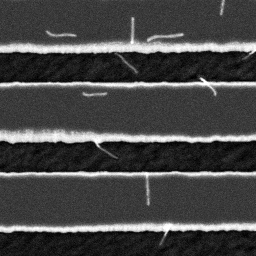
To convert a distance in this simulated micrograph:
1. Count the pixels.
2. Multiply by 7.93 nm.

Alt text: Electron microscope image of lines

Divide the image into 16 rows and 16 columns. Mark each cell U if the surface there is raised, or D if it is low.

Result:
UUUUUUUUUUUUUUUU
UUUUUUUUUUUUUUUU
UUUUUUUUUUUUUUUU
DDDDDDDDDDDDDDDD
DDDDDDDDDDDDDDDD
UUUUUUUUUUUUUUUU
UUUUUUUUUUUUUUUU
UUUUUUUUUUUUUUUU
UUUUUUUUUUUUUUUU
DDDDDDDDDDDDDDDD
DDDDDDDDDDDDDDDD
UUUUUUUUUUUUUUUU
UUUUUUUUUUUUUUUU
UUUUUUUUUUUUUUUU
DDDDDDDDDDDDDDDD
DDDDDDDDDDDDDDDD